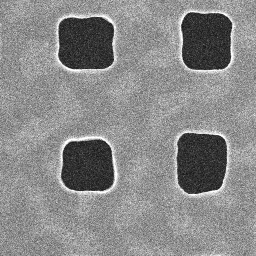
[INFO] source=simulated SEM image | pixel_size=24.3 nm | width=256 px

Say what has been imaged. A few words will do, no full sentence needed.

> holes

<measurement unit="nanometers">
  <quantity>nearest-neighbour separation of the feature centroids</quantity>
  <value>2840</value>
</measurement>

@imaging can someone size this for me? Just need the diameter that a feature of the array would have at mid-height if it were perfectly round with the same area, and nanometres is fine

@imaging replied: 1430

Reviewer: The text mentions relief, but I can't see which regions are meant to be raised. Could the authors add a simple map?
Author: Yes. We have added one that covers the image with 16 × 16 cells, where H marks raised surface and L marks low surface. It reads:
HHHHHHHHHHHHHHHH
HHHHLLLHHHHLLLHH
HHHHLLLHHHHLLLHH
HHHHLLLHHHHLLLHH
HHHHHHHHHHHHHHHH
HHHHHHHHHHHHHHHH
HHHHHHHHHHHHHHHH
HHHHHHHHHHHHHHHH
HHHHHHHHHHHLLLHH
HHHHLLLHHHHLLLHH
HHHHLLLHHHHLLLHH
HHHHLLLHHHHLLLHH
HHHHHHHHHHHHHHHH
HHHHHHHHHHHHHHHH
HHHHHHHHHHHHHHHH
HHHHHHHHHHHHHHHH